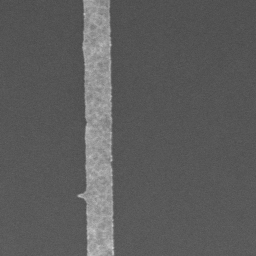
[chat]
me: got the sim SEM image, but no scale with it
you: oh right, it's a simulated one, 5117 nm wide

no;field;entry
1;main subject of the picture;one or a few lines or trenches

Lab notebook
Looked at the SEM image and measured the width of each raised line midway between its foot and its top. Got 505 nm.